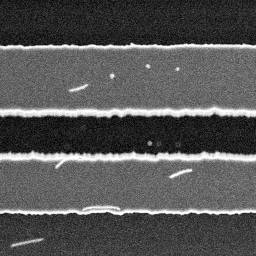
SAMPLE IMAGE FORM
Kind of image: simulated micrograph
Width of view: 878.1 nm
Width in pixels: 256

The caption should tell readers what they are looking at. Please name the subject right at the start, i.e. lines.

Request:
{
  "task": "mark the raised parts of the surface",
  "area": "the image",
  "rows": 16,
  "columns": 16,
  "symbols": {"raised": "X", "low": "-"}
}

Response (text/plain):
----------------
----------------
----------------
XXXXXXXXXXXXXXXX
XXXXXXXXXXXXXXXX
XXXXXXXXXXXXXXXX
XXXXXXXXXXXXXXXX
----------------
----------------
----------------
XXXXXXXXXXXXXXXX
XXXXXXXXXXXXXXXX
XXXXXXXXXXXXXXXX
----------------
----------------
----------------